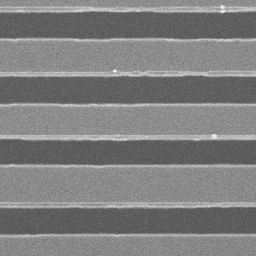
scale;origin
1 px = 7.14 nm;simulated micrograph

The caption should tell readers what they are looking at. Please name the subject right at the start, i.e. lines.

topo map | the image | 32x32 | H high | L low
HHHHHHHHHHHHHHHHHHHHHHHHHHHHHHHH
LLLLLLHLLLLLLLLLLLLLLLLLLLLHLLLL
LLLLLLLLLLLLLLLLLLLLLLLLLLLLLLLL
LLLLLLLLLLLLLLLLLLLLLLLLLLLLLLLL
LLLLLLLLLLLLLLLLLLLLLLLLLLLLLLLL
HHHHHHHHHHHHHHHHHHHHHHHHHHHHHHHH
HHHHHHHHHHHHHHHHHHHHHHHHHHHHHHHH
HHHHHHHHHHHHHHHHHHHHHHHHHHHHHHHH
HHHHHHHHHHHHHHHHHHHHHHHHHHHHHHHH
LLLLLLLLLLLLLLLLLLLLLLLLLLLLLLLL
LLLLLLLLLLLLLLLLLLLLLLLLLLLLLLLL
LLLLLLLLLLLLLLLLLLLLLLLLLLLLLLLL
LLLLLLLLLLLLLLLLLLLLLLLLLLLLLLLL
HHHHHHHHHHHHHHHHHHHHHHHHHHHHHHHH
HHHHHHHHHHHHHHHHHHHHHHHHHHHHHHHH
HHHHHHHHHHHHHHHHHHHHHHHHHHHHHHHH
HHHHHHHHHHHHHHHHHHHHHHHHHHHHHHHH
LLLLLLLLLLLLLLLLLLLLLLLLLLLLLLLL
LLLLLLLLLLLLLLLLLLLLLLLLLLLLLLLL
LLLLLLLLLLLLLLLLLLLLLLLLLLLLLLLL
LLLLLLLLLLLLLLLLLLLLLLLLLLLLLLLL
HHHHHHHHHHHHHHHHHHHHHHHHHHHHHHHH
HHHHHHHHHHHHHHHHHHHHHHHHHHHHHHHH
HHHHHHHHHHHHHHHHHHHHHHHHHHHHHHHH
HHHHHHHHHHHHHHHHHHHHHHHHHHHHHHHH
HHHHHHHHHHHHHHHHHHHHHHHHHHHHHHHH
LLLLLLLLLLLLLLLLLLLLLLLLLLLLLLLL
LLLLLLLLLLLLLLLLLLLLLLLLLLLLLLLL
LLLLLLLLLLLLLLLLLLLLLLLLLLLLLLLL
LHHHHHHHHHHHHHHHHHHHHHHHHHHHHHHH
HHHHHHHHHHHHHHHHHHHHHHHHHHHHHHHH
HHHHHHHHHHHHHHHHHHHHHHHHHHHHHHHH